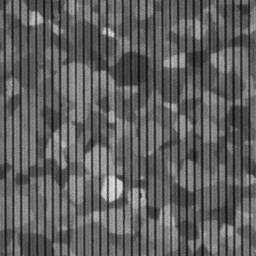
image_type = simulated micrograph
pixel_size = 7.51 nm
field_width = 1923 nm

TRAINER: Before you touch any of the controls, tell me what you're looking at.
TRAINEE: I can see parallel lines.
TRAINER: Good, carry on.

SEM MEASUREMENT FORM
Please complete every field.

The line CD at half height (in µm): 0.0385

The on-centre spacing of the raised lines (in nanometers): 59.2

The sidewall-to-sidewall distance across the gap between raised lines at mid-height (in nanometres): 19.7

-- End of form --